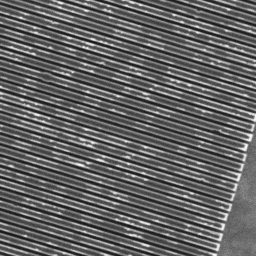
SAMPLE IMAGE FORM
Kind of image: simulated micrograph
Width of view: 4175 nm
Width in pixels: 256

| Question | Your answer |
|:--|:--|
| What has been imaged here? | parallel lines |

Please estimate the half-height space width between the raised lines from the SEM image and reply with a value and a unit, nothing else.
58.6 nanometers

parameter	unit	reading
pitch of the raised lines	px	10.4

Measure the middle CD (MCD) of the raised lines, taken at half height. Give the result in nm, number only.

106